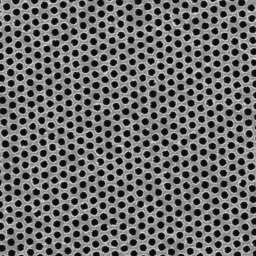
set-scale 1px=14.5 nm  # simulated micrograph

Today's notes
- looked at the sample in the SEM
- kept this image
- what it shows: a regular array of holes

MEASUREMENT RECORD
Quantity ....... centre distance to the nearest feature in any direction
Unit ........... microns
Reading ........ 0.154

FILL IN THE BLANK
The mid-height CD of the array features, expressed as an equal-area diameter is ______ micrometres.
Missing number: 0.107